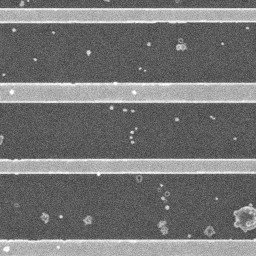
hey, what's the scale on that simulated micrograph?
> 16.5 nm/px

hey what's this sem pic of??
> lines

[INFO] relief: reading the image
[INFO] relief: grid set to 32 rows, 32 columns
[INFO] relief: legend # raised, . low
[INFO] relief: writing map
................................
################################
################################
................................
................................
................................
................................
................................
................................
................................
################################
################################
################################
................................
................................
................................
................................
................................
................................
................................
################################
################################
................................
................................
................................
................................
..............................##
.............................###
..............................##
................................
################################
################################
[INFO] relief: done